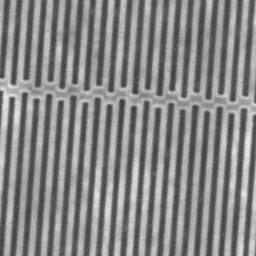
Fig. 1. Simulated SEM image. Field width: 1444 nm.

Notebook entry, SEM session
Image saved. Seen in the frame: parallel lines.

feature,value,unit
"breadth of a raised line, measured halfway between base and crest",22.5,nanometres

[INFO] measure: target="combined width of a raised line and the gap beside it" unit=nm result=68.9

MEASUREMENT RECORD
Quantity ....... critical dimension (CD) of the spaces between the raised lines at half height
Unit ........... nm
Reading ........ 45